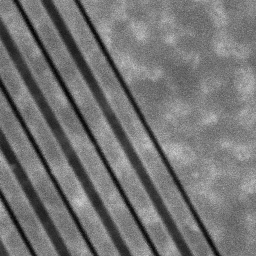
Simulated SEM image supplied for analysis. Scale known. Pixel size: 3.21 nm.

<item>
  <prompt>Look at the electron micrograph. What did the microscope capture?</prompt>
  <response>parallel lines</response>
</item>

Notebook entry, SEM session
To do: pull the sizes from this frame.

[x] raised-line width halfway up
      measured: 59.7 nanometres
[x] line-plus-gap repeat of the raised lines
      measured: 87.5 nanometres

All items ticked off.